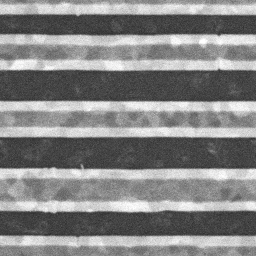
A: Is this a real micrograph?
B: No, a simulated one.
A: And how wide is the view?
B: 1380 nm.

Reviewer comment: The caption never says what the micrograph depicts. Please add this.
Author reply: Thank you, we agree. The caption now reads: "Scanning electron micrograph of one or a few lines or trenches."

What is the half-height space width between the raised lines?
188 nm